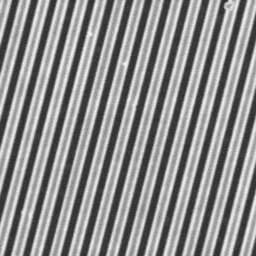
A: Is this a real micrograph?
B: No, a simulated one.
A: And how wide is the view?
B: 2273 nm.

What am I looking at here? parallel lines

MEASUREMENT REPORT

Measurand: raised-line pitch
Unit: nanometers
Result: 164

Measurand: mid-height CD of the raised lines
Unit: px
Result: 8.36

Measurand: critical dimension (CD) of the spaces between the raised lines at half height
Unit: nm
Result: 90.3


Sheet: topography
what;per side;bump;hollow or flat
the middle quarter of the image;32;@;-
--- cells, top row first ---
@---@@---@@---@@--@@---@@---@@--
@---@@---@@--@@---@@---@@---@@--
@---@@--@@---@@---@@---@---@@---
@--@@---@@---@@--@@---@@---@@---
---@@---@@---@@--@@---@@---@@--@
---@@---@@--@@---@@---@@---@---@
---@@--@@---@@---@@---@---@@---@
--@@---@@---@@---@---@@---@@---@
--@@---@@---@@--@@---@@---@@--@@
--@@---@@--@@---@@---@@---@---@@
--@@--@@---@@---@@---@---@@---@@
-@@---@@---@@---@---@@---@@---@@
-@@---@@---@@--@@---@@---@@--@@-
-@@---@@--@@---@@---@@--@@---@@-
@@@--@@---@@---@@---@---@@---@@-
@@---@@---@@---@---@@---@@---@@-
@@---@@---@@--@@---@@---@@--@@--
@@--@@@--@@---@@---@@---@---@@--
@@--@@---@@---@@---@---@@---@@--
@---@@---@@---@---@@---@@---@@--
@---@@--@@@--@@---@@---@@--@@---
@--@@---@@---@@---@@--@@---@@---
@--@@---@@---@@---@---@@---@@---
---@@---@@--@@---@@---@@---@@--@
---@@--@@---@@---@@---@@--@@---@
--@@---@@---@@---@@--@@---@@---@
--@@---@@---@@---@---@@---@@---@
--@@---@@--@@---@@---@@---@@--@@
--@@--@@---@@---@@---@@--@@---@@
-@@@--@@---@@---@@--@@---@@---@@
-@@---@@---@@--@@---@@---@@---@@
-@@---@@--@@---@@---@@---@@--@@-